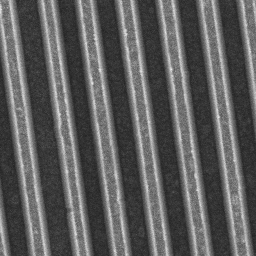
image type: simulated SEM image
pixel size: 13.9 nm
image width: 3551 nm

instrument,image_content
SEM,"parallel lines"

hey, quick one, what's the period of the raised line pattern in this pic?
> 556 nanometres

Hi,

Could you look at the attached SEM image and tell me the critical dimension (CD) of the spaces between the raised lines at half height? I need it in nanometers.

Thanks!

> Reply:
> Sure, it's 307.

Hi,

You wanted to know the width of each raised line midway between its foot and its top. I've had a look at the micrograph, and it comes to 17.5 pixels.